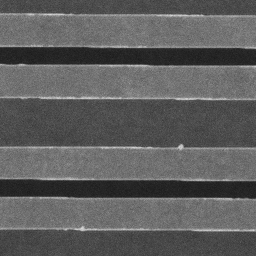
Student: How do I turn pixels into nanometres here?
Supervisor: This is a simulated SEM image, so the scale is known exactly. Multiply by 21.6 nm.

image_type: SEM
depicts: lines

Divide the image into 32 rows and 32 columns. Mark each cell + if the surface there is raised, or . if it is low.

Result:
................................
................................
++++++++++++++++++++++++++++++++
++++++++++++++++++++++++++++++++
++++++++++++++++++++++++++++++++
++++++++++++++++++++++++++++++++
................................
................................
++++++++++++++++++++++++++++++++
++++++++++++++++++++++++++++++++
++++++++++++++++++++++++++++++++
++++++++++++++++++++++++++++++++
................................
................................
................................
................................
................................
................................
+++++++++++++++++++...+.........
++++++++++++++++++++++++++++++++
++++++++++++++++++++++++++++++++
++++++++++++++++++++++++++++++++
......................++++++++++
................................
................................
++++++++++++++++++++++++++++++++
++++++++++++++++++++++++++++++++
++++++++++++++++++++++++++++++++
++++++++++++++++++++++++++++++++
................................
................................
................................